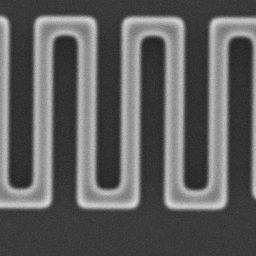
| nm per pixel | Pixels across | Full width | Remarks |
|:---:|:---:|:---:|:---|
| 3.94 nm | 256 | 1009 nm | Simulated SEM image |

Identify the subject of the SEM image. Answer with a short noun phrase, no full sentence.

groups of lines, slits or small figures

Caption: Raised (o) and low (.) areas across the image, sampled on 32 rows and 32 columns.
................................
................................
o....ooooooo....oooooo.....ooooo
o...oooooooo...oooooooo...oooooo
o...ooo..ooo...oooo.ooo...oooooo
o...ooo...oo...ooo...oo...oo....
o...ooo...oo...oo....oo...oo....
o...oo....oo...oo....oo...oo....
o...oo....oo...oo....oo...oo....
o...oo....oo...oo....oo...oo....
o...oo....oo...oo....oo...oo....
o...oo....oo...oo....oo...oo....
o...oo....oo...oo....oo...oo....
o...oo....oo...oo....oo...oo....
o...oo....oo...oo....oo...oo....
o...oo....oo...oo....oo...oo....
o...oo....oo...oo....oo...oo....
o...oo....oo...oo....oo...oo....
o...oo....oo...oo....oo...oo....
o...oo....oo...oo....oo...oo....
o...oo....oo...oo....oo...oo....
o...oo....oo...oo....oo...oo....
o...oo....oo...oo....oo...oo....
oo..oo....oo...oo....oo...oo....
oooooo....ooooooo....ooooooo....
oooooo....ooooooo....ooooooo....
................................
................................
................................
................................
................................
................................